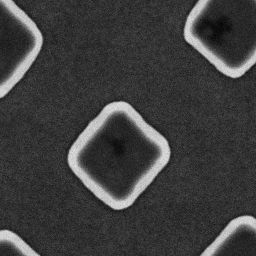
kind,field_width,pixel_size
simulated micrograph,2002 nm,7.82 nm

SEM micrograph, raised bodies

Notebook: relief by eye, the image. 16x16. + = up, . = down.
+...........++++
++..........++++
++..........++++
++...........+++
+.............+.
................
................
......+++.......
.....+++++......
.....+++++......
.....+++++......
......+++.......
.......+........
................
..............++
++...........+++